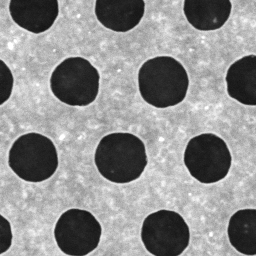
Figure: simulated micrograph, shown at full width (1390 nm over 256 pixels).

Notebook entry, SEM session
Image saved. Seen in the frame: holes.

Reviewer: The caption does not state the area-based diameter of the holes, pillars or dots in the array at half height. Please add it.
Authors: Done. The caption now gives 271 nanometres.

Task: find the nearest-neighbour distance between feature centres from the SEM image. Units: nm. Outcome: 471